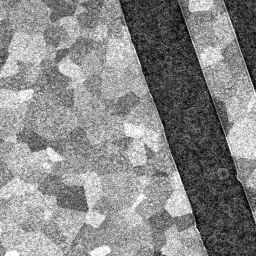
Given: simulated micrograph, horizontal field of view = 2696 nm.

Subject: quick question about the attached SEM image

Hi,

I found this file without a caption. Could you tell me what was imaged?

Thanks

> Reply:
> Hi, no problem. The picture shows one or a few lines or trenches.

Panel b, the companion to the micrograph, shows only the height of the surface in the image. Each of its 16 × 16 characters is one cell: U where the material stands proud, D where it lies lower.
UUUUUUUUDDDUUUDD
UUUUUUUUDDDDUUDD
UUUUUUUUDDDDUUUD
UUUUUUUUUDDDUUUD
UUUUUUUUUDDDDUUU
UUUUUUUUUDDDDUUU
UUUUUUUUUUDDDUUU
UUUUUUUUUUDDDDUU
UUUUUUUUUUDDDDUU
UUUUUUUUUUUDDDUU
UUUUUUUUUUUDDDDU
UUUUUUUUUUUDDDDU
UUUUUUUUUUUUDDDU
UUUUUUUUUUUUDDDD
UUUUUUUUUUUUDDDD
UUUUUUUUUUUUUDDD